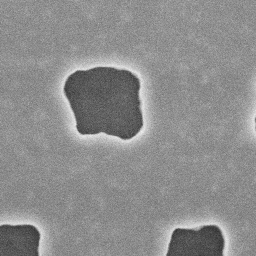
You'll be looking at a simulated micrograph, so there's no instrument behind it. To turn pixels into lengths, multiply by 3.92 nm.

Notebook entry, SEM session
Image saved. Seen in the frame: holes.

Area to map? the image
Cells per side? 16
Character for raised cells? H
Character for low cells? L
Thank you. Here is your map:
HHHHHHHHHHHHHHHH
HHHHHHHHHHHHHHHH
HHHHHHHHHHHHHHHH
HHHHHHHHHHHHHHHH
HHHHHLLLHHHHHHHH
HHHHLLLLLHHHHHHH
HHHHLLLLLHHHHHHH
HHHHHLLLLHHHHHHH
HHHHHHHLHHHHHHHH
HHHHHHHHHHHHHHHH
HHHHHHHHHHHHHHHH
HHHHHHHHHHHHHHHH
HHHHHHHHHHHHHHHH
HHHHHHHHHHHHHHHH
LLHHHHHHHHHLLLHH
LLHHHHHHHHHLLLHH